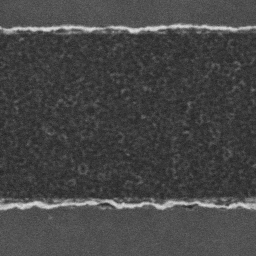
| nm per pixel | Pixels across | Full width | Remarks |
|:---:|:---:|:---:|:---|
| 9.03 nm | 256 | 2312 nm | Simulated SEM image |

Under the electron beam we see one or a few lines or trenches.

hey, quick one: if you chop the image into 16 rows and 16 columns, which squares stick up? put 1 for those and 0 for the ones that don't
0000000000000000
0000000000000000
1111111111111111
1111111111111111
1111111111111111
1111111111111111
1111111111111111
1111111111111111
1111111111111111
1111111111111111
1111111111111111
1111111111111111
1111111111111111
0000000000000000
0000000000000000
0000000000000000